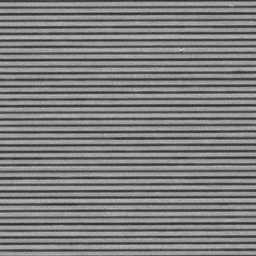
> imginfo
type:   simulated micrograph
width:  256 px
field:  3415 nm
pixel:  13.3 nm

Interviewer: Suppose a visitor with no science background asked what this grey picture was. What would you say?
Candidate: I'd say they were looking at parallel lines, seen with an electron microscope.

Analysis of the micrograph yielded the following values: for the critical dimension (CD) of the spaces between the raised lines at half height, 0.045 µm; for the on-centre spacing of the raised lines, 87.6 nm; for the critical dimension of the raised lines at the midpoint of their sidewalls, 46.7 nm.